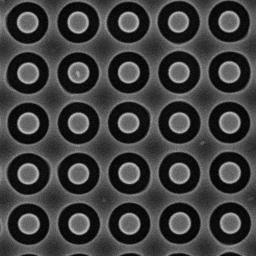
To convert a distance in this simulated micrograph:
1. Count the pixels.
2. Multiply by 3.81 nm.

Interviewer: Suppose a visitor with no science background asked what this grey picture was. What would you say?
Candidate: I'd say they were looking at an array of small figures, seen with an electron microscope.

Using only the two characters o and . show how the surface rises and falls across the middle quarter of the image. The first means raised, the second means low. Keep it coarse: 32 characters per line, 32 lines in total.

..ooo....oo...oooo...ooo...oooo.
.ooooo...oo...ooooo...oo..ooooo.
.ooooo...oo...ooooo...o...ooooo.
..oooo...oo...oooo...ooo...oooo.
...oo...ooo....oo....ooo........
........oooo........ooooo.......
.......oooooo......ooooooo......
o...oooooooooooooooooooooooo..oo
oooooooooooooooooooooooooooooooo
oo...oooooooooo...ooooooooo....o
.......oooooo.......ooooo.......
........oooo.........oooo.......
...o....ooo...........oo....oo..
..oooo...oo...oooo....oo...oooo.
.ooooo...oo...oooo....o....oooo.
.ooooo...oo...oooo...ooo...oooo.
..oooo...oo...oooo...ooo...oooo.
........oooo.........ooo........
.......ooooo........ooooo.......
o.....oooooooo....oooooooo.....o
oooooooooooooooooooooooooooooooo
oooooooooooooooooooooooooooooooo
oo....oooooooo....oooooooo.....o
.......oooooo.......ooooo.......
........oooo.........ooo........
..ooo....oo....ooo...ooo...oooo.
.ooooo...oo...ooooo...o....oooo.
.ooooo...oo...ooooo...o....oooo.
.ooooo...oo...ooooo...oo...oooo.
..ooo....oo....oo....ooo....oo..
........oooo.........oooo.......
.......oooooo.......oooooo......